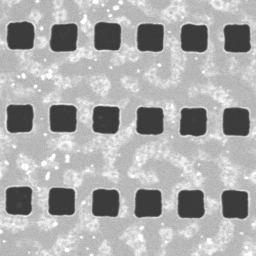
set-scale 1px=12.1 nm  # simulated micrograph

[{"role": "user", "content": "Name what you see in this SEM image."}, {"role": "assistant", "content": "a regular array of holes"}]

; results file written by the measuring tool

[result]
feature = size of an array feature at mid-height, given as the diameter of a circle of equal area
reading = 363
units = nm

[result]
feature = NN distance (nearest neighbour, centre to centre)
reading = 521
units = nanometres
